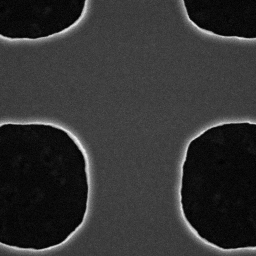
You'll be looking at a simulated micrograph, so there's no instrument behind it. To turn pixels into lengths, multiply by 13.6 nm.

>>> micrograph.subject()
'holes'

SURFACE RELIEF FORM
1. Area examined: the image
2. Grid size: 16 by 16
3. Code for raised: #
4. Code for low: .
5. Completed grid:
.....#######....
.....#######....
################
################
################
################
################
################
....########....
.....#######....
.....######.....
......#####.....
.....######.....
.....#######....
.....#######....
#..###########.#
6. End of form